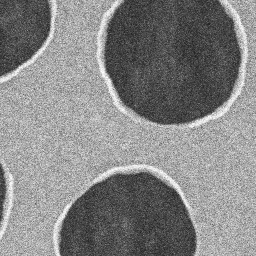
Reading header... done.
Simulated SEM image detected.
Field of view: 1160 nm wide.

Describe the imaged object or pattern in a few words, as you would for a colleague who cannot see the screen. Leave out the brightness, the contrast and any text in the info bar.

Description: holes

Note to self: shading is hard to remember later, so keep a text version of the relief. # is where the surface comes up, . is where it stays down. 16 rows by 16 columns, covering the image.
...####.......##
...####........#
...###.........#
..####.........#
.######........#
#######........#
########......##
#########...####
################
################
################
######.....#####
#####......#####
####........####
####........####
####........####